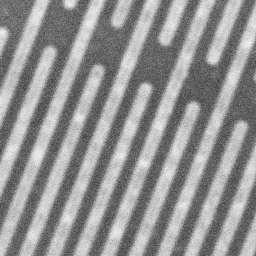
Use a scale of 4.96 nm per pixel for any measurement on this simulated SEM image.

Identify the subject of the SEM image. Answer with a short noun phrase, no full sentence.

parallel lines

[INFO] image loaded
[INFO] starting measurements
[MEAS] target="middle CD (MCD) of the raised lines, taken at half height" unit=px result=10.5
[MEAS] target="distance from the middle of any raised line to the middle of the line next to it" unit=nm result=127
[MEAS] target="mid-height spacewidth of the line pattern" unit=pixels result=14.7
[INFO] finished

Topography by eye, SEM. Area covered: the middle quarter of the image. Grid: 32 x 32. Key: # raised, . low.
.##.....#.....###...........###.
###....###....###...........###.
###....###....###..........####.
##....###....###...........###..
##....###....###...........##...
#.....##....###....##.....###...
#....###....###....###....###...
#....###....###....##....###....
.....##....###....###....###....
....###....###....###....###....
....##....###....###....###....#
...###....###....###....###....#
...###....###....##....###....##
...##....###....###....###....##
..###....###....###....###....##
..###....##....###....###....###
.###....###....###....###....###
.###....###....##....###....###.
.##....###....###....###....###.
###....###....###....###....###.
###....###....##....###....###..
##....###....###....###....###..
##....###....##....###....###...
#....###....###....###....###...
#....###....###....###....###...
#....###....##....###....###....
....###....###....###....###....
....###....###....##....###....#
...###....###....###....###....#
...###....###....###....###....#
...###....##....###....###....##
..###....###....###....###....##